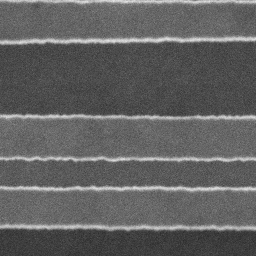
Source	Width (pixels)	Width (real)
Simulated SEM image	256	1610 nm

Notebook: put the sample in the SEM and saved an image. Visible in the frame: lines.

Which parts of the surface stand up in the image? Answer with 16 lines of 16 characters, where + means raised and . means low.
++++++++++++++++
++++++++++++++++
++++++++.+......
................
................
................
................
++++++++++++++++
++++++++++++++++
++++++++++++++++
++++++++++++++++
++++++++++++++++
++++++++++++++++
++++++++++++++++
................
................